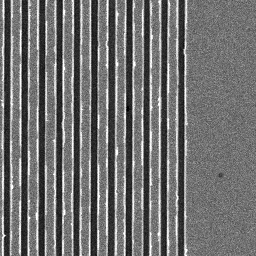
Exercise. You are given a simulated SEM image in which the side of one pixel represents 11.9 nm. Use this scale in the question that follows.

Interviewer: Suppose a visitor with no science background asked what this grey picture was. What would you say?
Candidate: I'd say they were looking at parallel lines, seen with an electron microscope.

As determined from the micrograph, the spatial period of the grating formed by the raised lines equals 207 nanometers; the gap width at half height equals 81.9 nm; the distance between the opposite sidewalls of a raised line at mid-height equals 0.124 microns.